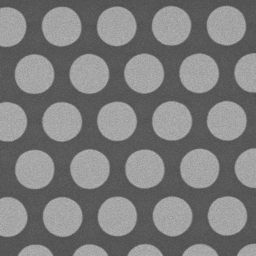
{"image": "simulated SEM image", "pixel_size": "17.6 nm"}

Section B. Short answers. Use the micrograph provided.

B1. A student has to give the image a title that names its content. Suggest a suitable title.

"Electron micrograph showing an array of small figures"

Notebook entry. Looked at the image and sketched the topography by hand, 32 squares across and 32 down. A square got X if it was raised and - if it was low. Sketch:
--------------------------------
XX----XXX----XXX----XXX----XXX--
XXX--XXXXX--XXXXX--XXXXX--XXXXX-
XXX--XXXXX--XXXXX--XXXXX--XXXXX-
XXX---XXXX---XXXX--XXXX---XXXX--
XX-----XX-----XX-----X-----XX---
--------------------------------
---XXX----XXX---XXXX---XXXX---XX
--XXXXX--XXXXX--XXXX---XXXX--XXX
--XXXXX--XXXXX--XXXX---XXXX--XXX
--XXXX---XXXX---XXXX---XXXX---XX
---XX-----XX-----XX-----X-------
--------------------------------
XXX---XXX----XXX----XXX----XXX--
XXX--XXXXX--XXXXX--XXXXX--XXXXX-
XXX--XXXXX--XXXXX--XXXXX--XXXXX-
XXX---XXXX---XXXX--XXXXX--XXXX--
XX-----XX-----X-------------X---
--------------------------------
---XXX---XXXX---XXXX---XXXX---XX
--XXXXX--XXXXX--XXXX---XXXX--XXX
--XXXXX--XXXXX--XXXXX--XXXX--XXX
--XXXX---XXXX---XXXX---XXXX---XX
----X------X--------------------
--------------------------------
XXX---XXXX---XXXX---XXX----XXX--
XXX--XXXXX--XXXXX--XXXXX--XXXXX-
XXX--XXXXX--XXXXX--XXXXX--XXXXX-
XXX---XXXX---XXXX---XXX----XXX--
-------X-------------X----------
--------------------------------
---XXX---XXXX---XXXX---XXXX---XX